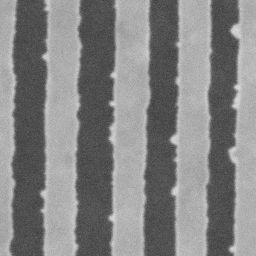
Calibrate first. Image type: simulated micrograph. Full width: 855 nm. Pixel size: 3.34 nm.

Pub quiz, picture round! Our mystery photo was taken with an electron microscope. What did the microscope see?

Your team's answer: lines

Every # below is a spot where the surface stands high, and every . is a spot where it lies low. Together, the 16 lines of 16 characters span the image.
#..##..##..##..#
#..##..##..##..#
#..##..##..##..#
#..##..##..##..#
#..##..##..##..#
#..##..##..##..#
#..##..##..##..#
#..##..##..##..#
#..##..##..##..#
#..##..##..##.##
#..##..##..##..#
#..##..##..##..#
#..##..##..##..#
#..##..##..##..#
#..##..##..##..#
#..##..##..##..#